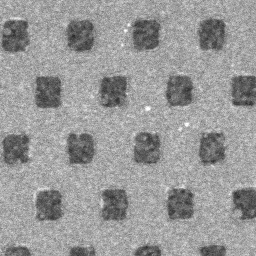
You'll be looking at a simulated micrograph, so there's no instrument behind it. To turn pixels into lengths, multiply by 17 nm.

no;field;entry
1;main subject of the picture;a regular array of raised bodies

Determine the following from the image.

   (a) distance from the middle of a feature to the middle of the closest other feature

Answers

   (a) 1110 nanometres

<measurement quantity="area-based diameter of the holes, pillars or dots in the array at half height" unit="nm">550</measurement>